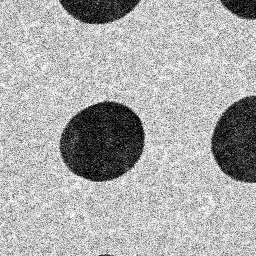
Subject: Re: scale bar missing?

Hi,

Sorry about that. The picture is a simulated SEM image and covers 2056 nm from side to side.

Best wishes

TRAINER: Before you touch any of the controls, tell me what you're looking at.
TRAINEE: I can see holes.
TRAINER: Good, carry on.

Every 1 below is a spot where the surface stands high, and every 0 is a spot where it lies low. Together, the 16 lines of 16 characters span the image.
1111000011111100
1111111111111111
1111111111111111
1111111111111111
1111111111111111
1111111111111111
1111110011111110
1111000001111100
1111000001111000
1111000001111000
1111000011111100
1111111111111111
1111111111111111
1111111111111111
1111111111111111
1111111111111111